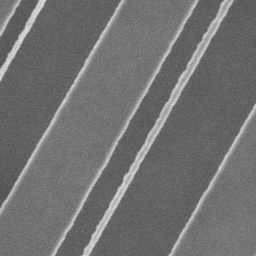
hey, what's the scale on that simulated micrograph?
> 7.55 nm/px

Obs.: lines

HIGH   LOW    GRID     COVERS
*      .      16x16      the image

***....*******..
**.....*******..
*.....*******...
*.....*******...
.....*******....
....*******.....
....*******.....
...*******.....*
...*******.....*
..*******.....**
..*******.....**
.*******.....***
*******......***
*******.....****
******.....*****
******.....*****